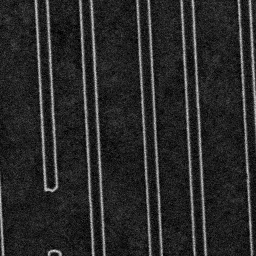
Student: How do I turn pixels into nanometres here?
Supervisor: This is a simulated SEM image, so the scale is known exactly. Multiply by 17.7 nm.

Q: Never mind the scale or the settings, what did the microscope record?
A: parallel lines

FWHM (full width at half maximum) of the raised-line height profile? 198 nm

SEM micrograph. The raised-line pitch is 880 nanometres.